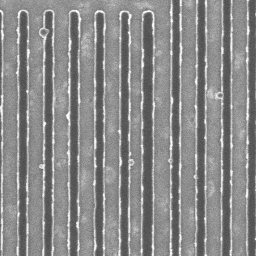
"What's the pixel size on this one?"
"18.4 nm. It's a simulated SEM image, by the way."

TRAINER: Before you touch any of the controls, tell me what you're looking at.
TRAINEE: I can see parallel lines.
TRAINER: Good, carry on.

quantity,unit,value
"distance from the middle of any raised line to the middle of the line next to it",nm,469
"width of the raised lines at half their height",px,10.4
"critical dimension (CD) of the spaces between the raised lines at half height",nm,281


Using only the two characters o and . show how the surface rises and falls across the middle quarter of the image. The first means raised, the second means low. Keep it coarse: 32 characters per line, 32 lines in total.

.ooo....oo....oo....oo.....oo...
.ooo....oo....ooo...ooo....oo...
.ooo....oo....ooo...ooo....oo...
.ooo....oo....oo....oo.....oo...
.ooo....oo....oo....oo.....oo...
.ooo....oo....oo...ooo.....oo...
.ooo....oo....ooo..ooo.....oo...
.ooo....oo....oo...ooo.....oo...
.ooo....oo....oo....oo.....oo...
.ooo....oo....ooo..oooo....oo...
.ooo....oo....ooo..oooo....oo...
.ooo....oo....ooo..ooo.....oo...
.ooo....oo....oo...ooo.....oo...
.ooo....oo....oo...ooo.....oo...
.ooo....oo....oo....oo.....oo...
.ooo....oo....oo....oo.....oo...
.ooo....oo....oo...ooo.....oo...
.ooo....oo....oo...ooo.....oo...
.ooo....oo....oo...ooo.....oo...
.ooo....oo....oo...ooo.....oo...
.ooo....oo....oo...ooo.....oo...
.ooo....oo....oo....oo.....oo...
.ooo....oo....ooo...oo.....oo...
.ooo....oo....ooo...oo.....oo...
.ooo....oo....ooo...oo....ooo...
.ooo....oo....ooo...oo.....oo...
.ooo....oo....oo....oo.....oo...
.ooo....oo....oo...ooo.....oo...
.ooo....oo....oo...ooo.....oo...
.ooo...ooo....oo...ooo.....oo...
.ooo...ooo....oo...ooo.....oo...
.ooo....oo....oo...ooo.....oo...